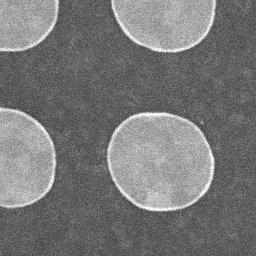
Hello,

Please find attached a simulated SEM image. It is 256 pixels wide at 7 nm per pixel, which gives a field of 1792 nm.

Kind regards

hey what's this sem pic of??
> raised bodies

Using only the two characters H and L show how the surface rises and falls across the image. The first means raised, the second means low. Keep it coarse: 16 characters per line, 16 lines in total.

HHHHLLLHHHHHHLLL
HHHLLLLLHHHHHLLL
HHHLLLLLHHHHHLLL
LLLLLLLLLLLLLLLL
LLLLLLLLLLLLLLLL
LLLLLLLLLLLLLLLL
LLLLLLLLLLLLLLLL
HHLLLLLLHHHHLLLL
HHHLLLLHHHHHHLLL
HHHLLLLHHHHHHLLL
HHHLLLLHHHHHHLLL
HHHLLLLHHHHHHLLL
HHLLLLLLHHHHLLLL
LLLLLLLLLLLLLLLL
LLLLLLLLLLLLLLLL
LLLLLLLLLLLLLLLL